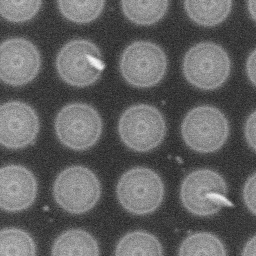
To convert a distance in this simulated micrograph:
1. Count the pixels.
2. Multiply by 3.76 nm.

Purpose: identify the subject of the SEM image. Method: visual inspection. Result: an array of small figures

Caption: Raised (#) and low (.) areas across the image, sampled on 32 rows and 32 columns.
.....###.....###.....##......##.
....####....####....####....####
##########.######..######..#####
################################
################################
#..######..#####################
....####....####....####....####
.....##....####.....###.....###.
.....##.....###.....###.....###.
....####....####....####....###.
#################.#######..#####
################################
################################
...######..######.##############
....####....####....####....####
....###.....###.....###.....###.
....###.....###.....###.....###.
....####....####....###.....###.
#################.#######..#####
################################
################################
...#####...######..#############
....###.....###.....###....####.
....###.....###.....###.....###.
....###.....###.....###...#####.
...#####...#####....###....####.
#########################.######
################################
################################
...#####...#####..#######.######
....###.....###.....###....####.
....###.....###.....###.....###.